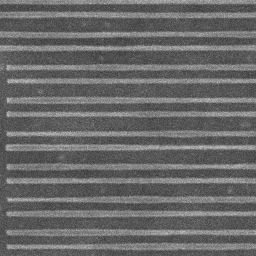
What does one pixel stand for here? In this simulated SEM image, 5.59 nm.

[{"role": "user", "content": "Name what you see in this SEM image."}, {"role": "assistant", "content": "parallel lines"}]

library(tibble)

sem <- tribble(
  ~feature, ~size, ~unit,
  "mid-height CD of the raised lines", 25.9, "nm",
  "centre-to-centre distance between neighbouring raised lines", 16.6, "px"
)